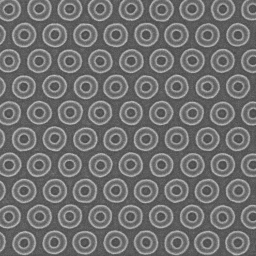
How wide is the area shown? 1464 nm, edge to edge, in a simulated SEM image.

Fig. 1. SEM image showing a regular array of ring-shaped raised bodies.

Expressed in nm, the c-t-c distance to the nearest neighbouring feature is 170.